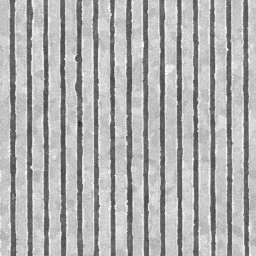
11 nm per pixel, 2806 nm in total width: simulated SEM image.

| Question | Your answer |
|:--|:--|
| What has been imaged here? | parallel lines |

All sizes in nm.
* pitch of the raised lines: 182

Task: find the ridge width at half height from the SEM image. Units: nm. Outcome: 122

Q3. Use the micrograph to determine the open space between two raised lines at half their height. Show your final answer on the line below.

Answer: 65.8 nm